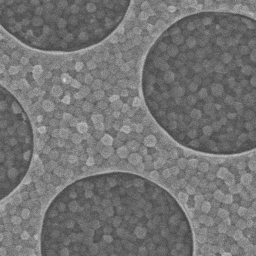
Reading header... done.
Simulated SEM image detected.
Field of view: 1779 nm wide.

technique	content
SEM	holes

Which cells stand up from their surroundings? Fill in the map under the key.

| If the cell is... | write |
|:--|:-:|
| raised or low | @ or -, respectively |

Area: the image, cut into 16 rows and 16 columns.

--------@@@@@@@@
--------@@@-----
@-----@@@@------
@@@@@@@@@-------
@@@@@@@@@-------
@@@@@@@@@-------
-@@@@@@@@-------
--@@@@@@@@------
--@@@@@@@@@-----
--@@@@@@@@@@---@
--@@@@@@@@@@@@@@
-@@@------@@@@@@
@@@--------@@@@@
@@@---------@@@@
@@@---------@@@@
@@@---------@@@@